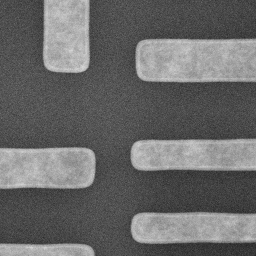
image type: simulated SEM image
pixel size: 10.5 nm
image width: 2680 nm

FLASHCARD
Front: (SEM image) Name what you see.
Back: groups of lines, slits or small figures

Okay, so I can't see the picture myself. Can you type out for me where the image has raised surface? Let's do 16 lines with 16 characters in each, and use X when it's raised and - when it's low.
---XX-----------
---XX-----------
---XX-----------
---XX----XXXXXXX
---------XXXXXXX
----------------
----------------
----------------
----------------
XXXXXX--XXXXXXXX
XXXXXX---XXXXXXX
XXXXX-----------
----------------
---------XXXXXXX
--------XXXXXXXX
XXXXX-----------